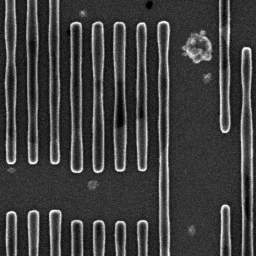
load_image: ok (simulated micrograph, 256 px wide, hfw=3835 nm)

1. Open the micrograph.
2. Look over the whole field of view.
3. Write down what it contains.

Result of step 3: wiring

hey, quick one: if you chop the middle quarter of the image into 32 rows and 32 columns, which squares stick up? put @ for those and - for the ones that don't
--@@---@@@---@@----@----@@------
--@@---@@@---@@----@----@@------
--@@----@@---@@----@@---@@------
--@@----@@---@@---@@@---@@------
--@@----@@---@@---@@@---@@------
--@@----@@---@@---@@@---@@------
--@@----@@---@@---@@@---@@------
--@@----@@---@@---@@@---@@------
--@@----@@---@@---@@@---@@------
--@@----@@---@@---@@@---@@------
--@@----@@---@@---@@@---@@------
--@@----@@---@@---@@@---@@------
--@@----@@---@@@--@@@---@@------
--@@---@@@---@@@--@@@---@@------
--@@---@@@---@@@--@@@---@@------
--@@---@@@---@@@--@@@---@@------
--@@---@@@---@@@--@@@---@@------
--@@---@@@---@@@--@@@---@@------
--@@---@@@---@@@--@@@---@@------
--@@---@@@---@@@--@@@---@@------
--@@@--@@@---@@---@@@---@@------
--@@@--@@@---@@----@@---@@------
--@@@--@@@---@@----@@---@@------
--@@@--@@@---@@----@@---@@------
--@@@--@@@---@@----@@---@@------
--@@@--@@@---@@----@@---@@------
--@@@---@@---@@----@----@@------
------------------------@@------
------------------------@@------
------------------------@@------
------------------------@@------
------------------------@@------